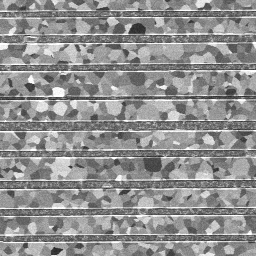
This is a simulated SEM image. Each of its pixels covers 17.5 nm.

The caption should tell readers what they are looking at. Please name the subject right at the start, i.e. parallel lines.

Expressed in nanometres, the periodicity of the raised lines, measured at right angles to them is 497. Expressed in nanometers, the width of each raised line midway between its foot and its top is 348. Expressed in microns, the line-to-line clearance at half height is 0.127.